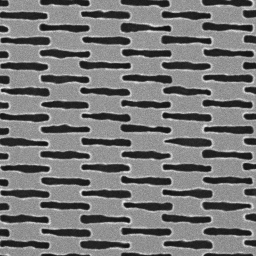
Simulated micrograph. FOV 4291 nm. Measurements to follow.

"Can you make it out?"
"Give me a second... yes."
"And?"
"a regular array of holes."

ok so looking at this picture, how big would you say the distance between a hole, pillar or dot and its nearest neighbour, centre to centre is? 427 nm